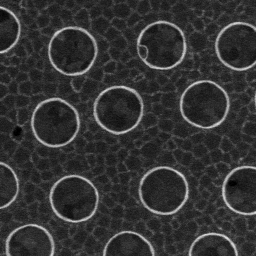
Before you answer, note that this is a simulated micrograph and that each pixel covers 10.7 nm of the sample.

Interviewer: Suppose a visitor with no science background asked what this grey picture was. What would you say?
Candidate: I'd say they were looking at raised bodies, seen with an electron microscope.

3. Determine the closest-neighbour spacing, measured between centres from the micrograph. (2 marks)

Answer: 778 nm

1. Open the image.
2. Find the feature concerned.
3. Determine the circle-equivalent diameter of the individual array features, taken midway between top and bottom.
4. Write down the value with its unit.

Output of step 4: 502 nanometers